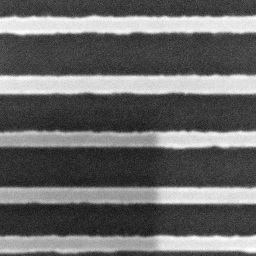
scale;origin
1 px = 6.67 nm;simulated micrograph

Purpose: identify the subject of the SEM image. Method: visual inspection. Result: lines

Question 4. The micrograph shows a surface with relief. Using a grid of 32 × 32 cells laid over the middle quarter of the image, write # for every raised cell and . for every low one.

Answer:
................................
................................
................................
################################
################################
################################
################################
................................
................................
................................
................................
................................
................................
................................
................................
................................
................................
################################
################################
################################
................................
................................
................................
................................
................................
................................
................................
................................
................................
................................
................................
################################